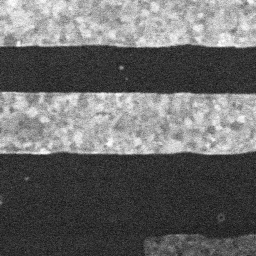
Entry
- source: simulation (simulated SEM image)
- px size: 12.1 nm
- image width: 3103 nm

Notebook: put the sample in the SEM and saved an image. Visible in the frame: wiring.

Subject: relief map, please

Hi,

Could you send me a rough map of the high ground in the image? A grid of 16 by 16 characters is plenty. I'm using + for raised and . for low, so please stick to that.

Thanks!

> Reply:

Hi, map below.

++++++++++++++++
++++++++++++++++
++++++++++++++++
................
................
................
++++++++++++++++
++++++++++++++++
++++++++++++++++
+++....++....++.
................
................
................
................
................
..........++++++